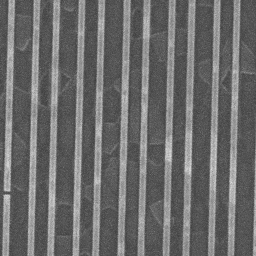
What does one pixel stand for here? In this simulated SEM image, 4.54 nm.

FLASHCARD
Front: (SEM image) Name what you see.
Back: parallel lines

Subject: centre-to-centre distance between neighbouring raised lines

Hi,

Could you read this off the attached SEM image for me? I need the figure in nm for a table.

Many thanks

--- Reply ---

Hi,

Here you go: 102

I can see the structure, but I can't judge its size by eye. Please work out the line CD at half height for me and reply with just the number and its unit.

0.0283 um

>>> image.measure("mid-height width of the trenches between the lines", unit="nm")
85.6